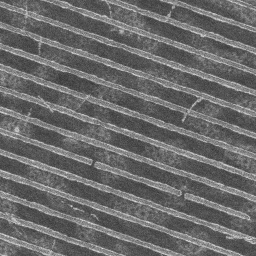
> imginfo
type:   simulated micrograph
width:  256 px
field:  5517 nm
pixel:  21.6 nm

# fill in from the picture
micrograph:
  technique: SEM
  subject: parallel lines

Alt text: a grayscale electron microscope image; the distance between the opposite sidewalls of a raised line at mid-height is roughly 338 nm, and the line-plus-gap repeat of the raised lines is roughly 429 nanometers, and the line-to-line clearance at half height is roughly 91.5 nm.